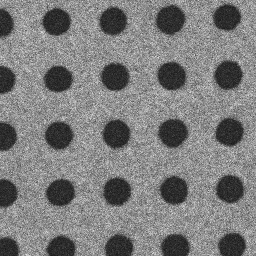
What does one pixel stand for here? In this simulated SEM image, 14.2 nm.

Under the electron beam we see a regular array of holes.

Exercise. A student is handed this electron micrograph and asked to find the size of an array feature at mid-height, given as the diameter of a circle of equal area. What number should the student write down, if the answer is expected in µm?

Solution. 0.397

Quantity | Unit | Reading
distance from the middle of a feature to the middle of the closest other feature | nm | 799